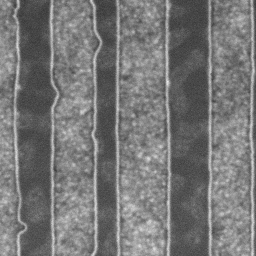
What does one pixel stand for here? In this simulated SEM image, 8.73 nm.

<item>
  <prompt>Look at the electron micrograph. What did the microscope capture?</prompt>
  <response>one or a few lines or trenches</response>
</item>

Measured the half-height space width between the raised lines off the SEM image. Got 370 nanometres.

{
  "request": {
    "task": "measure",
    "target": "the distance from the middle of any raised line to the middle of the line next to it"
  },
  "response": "673 nm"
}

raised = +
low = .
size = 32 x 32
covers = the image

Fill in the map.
..+++++.....+++......+++++.....+
..++++......+++......+++++.....+
..++++......+++......+++++......
..++++......+++......+++++......
..++++......+++......+++++......
..++++.......++......+++++......
..+++++.....+++......+++++......
..+++++.....+++......+++++......
..++++......+++......+++++......
..++++......+++......+++++......
..+++++.....+++......+++++.....+
..+++++.....+++......+++++.....+
..+++++.....+++......+++++.....+
..+++++.....+++......+++++.....+
..+++++.....+++......+++++.....+
..+++++.....+++......+++++.....+
..+++++.....+++......+++++.....+
..+++++.....+++......+++++.....+
..+++++.....+++......+++++......
..+++++.....+++......+++++......
..+++++.....+++......+++++......
..+++++.....+++......+++++......
..+++++.....+++......+++++......
..+++++.....+++......+++++......
..+++++.....+++......+++++.....+
..+++++.....+++......+++++......
..+++++.....+++......+++++......
..+++++.....+++......+++++......
...++++.....+++......+++++......
..+++++.....+++......+++++......
..+++++.....+++......+++++......
..+++++.....+++......+++++......